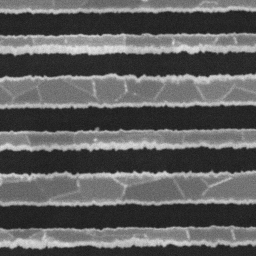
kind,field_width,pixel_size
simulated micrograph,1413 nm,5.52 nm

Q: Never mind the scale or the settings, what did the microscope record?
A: lines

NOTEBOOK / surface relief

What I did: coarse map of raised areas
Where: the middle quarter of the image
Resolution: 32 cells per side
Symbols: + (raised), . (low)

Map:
................................
................................
............+...................
++++++++++++++++++.+++++.+++++++
++++++++++++++++++++++++++++++++
++++++++++++++++++++++++++++++++
++++++++++++++++++++++++++++++++
++++++++++++++++++++++++++++++++
++++++++++++++++++++++++++++++++
++++++++++++++++++++++++++++++++
+.+++....+.+....................
................................
................................
................................
................................
................................
..............+..........+......
++++++++++++++++++++++++++++++++
++++++++++++++++++++++++++++++++
++++++++++++++++++++++++++++++++
++++++++++++++++.++..+.+++++++..
................................
................................
................................
................................
................................
................................
+........++..+++.+..++.+++.+++.+
++++++++++++++++++++++++++++++++
++++++++++++++++++++++++++++++++
++++++++++++++++++++++++++++++++
++++++++++++++++++++++++++++++++